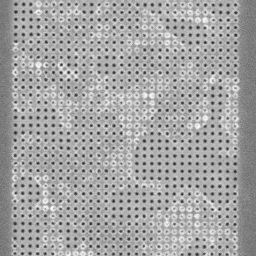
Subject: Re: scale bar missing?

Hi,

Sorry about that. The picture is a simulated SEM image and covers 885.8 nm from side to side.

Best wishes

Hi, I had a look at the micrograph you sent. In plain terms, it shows a regular array of holes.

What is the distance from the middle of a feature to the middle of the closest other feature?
25 nm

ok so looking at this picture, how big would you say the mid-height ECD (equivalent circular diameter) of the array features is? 11.7 nm